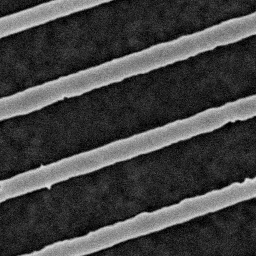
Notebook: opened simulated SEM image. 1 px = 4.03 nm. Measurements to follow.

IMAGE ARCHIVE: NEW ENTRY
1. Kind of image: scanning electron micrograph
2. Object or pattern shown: one or a few lines or trenches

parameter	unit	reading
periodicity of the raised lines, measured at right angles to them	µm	0.312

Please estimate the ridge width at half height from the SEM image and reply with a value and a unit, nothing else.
81.6 nm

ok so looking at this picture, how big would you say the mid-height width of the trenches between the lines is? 231 nm